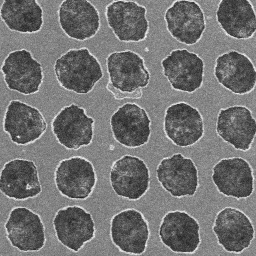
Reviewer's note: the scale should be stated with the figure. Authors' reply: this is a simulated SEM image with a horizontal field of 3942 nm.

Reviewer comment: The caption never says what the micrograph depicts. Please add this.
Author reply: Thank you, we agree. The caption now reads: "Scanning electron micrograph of a regular array of holes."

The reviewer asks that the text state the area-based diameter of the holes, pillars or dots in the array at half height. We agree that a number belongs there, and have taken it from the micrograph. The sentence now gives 632 nanometers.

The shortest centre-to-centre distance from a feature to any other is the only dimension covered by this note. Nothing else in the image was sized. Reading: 763 nm